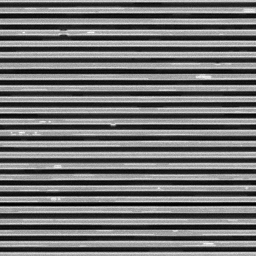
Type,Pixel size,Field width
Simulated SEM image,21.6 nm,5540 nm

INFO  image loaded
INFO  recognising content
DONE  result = parallel lines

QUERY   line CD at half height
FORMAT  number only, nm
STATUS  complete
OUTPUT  130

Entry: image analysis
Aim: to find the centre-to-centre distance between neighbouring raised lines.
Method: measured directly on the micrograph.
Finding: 11.1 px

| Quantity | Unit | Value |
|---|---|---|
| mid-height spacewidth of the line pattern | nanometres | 108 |